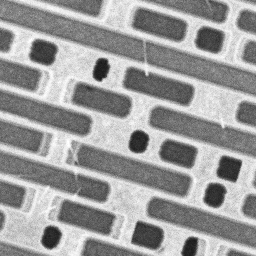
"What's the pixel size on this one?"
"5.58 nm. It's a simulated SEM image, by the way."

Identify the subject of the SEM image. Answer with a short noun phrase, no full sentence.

parallel lines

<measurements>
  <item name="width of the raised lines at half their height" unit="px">6.83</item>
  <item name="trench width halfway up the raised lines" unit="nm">128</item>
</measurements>